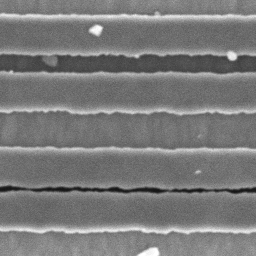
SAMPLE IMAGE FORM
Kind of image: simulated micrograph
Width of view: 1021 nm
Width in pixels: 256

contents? lines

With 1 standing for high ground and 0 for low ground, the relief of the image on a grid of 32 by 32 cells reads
00000000000000000000000000000000
00000000000000000000000000000000
11111111111111111111111111111111
11111111111111111111111111111111
11111111111111111111111111111111
11111111111111111111111111111111
11111111111111111111111111111111
00000000000000000000000000000000
00000000000000000000000000000000
11111111111111111111111111111111
11111111111111111111111111111111
11111111111111111111111111111111
11111111111111111111111111111111
11111111111111111111111111111111
00000000000000000000000000000000
00000000000000000000000000000000
00000000000000000000000000000000
00000000000000000000000000000000
11101110000001100000000000000000
11111111111111111111111111111111
11111111111111111111111111111111
11111111111111111111111111111111
11111111111111111111111111111111
00111110111111011101111111111111
11111111111111111111111111111111
11111111111111111111111111111111
11111111111111111111111111111111
11111111111111111111111111111111
11111111111111111111111111111111
00000000000000000000000000000000
00000000000000000000000000000000
00000000000000000000000000000000